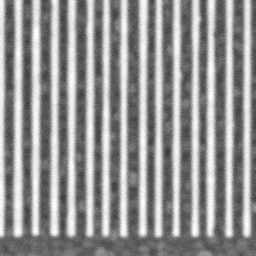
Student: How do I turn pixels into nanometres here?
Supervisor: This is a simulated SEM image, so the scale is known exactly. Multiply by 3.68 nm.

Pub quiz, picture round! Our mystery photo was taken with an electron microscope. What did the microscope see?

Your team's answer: parallel lines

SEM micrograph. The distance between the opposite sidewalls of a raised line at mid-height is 21.1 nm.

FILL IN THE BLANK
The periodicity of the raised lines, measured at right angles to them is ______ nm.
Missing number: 64.7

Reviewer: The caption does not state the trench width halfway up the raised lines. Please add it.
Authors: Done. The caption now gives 44.6 nm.